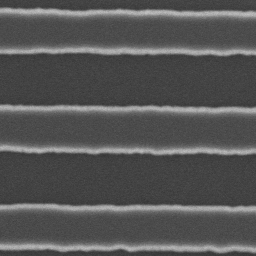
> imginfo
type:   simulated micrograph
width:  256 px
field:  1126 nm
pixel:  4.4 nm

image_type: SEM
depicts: lines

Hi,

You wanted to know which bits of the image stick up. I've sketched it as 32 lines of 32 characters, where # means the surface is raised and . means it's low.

................................
########...######.###...........
################################
################################
################################
################################
####........###.################
................................
................................
................................
................................
................................
................................
#####.#######...####............
################################
################################
################################
################################
################################
................................
................................
................................
................................
................................
................................
................................
################################
################################
################################
################################
################################
................................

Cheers